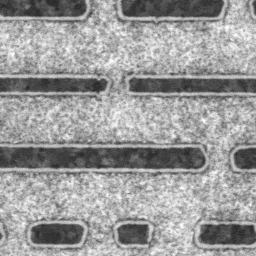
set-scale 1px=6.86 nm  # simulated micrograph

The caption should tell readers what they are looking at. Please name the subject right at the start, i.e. one or a few lines or trenches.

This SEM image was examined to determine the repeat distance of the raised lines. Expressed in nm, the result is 508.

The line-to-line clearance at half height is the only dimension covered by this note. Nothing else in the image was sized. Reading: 0.369 um